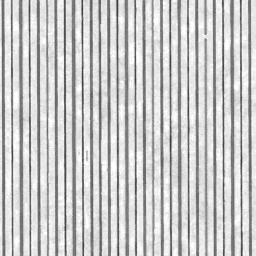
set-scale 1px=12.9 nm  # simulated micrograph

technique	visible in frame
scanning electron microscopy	parallel lines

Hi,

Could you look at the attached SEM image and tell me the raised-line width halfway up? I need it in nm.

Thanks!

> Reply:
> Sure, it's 80.9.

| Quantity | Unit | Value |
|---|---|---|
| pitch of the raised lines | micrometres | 0.114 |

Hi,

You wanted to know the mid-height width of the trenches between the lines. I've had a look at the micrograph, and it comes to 35.6 nanometres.